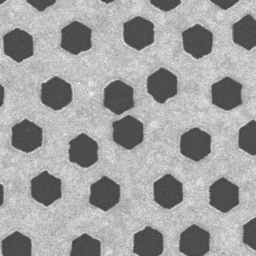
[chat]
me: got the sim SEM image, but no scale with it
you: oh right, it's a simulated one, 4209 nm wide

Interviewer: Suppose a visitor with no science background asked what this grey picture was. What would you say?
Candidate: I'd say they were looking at a regular array of holes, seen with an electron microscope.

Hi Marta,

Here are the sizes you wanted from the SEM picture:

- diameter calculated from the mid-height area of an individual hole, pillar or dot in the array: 530 nm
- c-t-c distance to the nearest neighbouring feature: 888 nm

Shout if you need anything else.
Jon